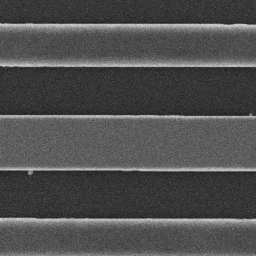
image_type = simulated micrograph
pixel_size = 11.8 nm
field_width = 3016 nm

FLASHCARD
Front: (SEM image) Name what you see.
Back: lines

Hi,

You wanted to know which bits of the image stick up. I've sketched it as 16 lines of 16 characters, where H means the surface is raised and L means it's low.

LLLLLLLLLLLLLLLL
LLLLLLLLLLLLLLLL
HHHHHHHHHHHHHHHH
HHHHHHHHHHHHHHHH
LLLLLLLLLLLLLLLL
LLLLLLLLLLLLLLLL
LLLLLLLLLLLLLLLL
HHHHHHHHHHHHHHHH
HHHHHHHHHHHHHHHH
HHHHHHHHHHHHHHHH
HHHHHHHHHHHHHHHH
LLLLLLLLLLLLLLLL
LLLLLLLLLLLLLLLL
LLLLLLLLLLLLLLLL
HHHHHHHHHHHHHHHH
HHHHHHHHHHHHHHHH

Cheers